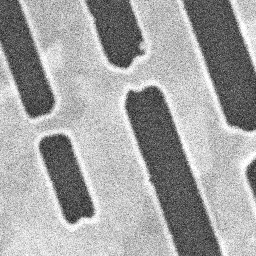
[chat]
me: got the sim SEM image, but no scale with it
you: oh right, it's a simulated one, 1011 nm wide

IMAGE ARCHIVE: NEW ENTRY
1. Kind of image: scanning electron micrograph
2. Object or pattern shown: one or a few lines or trenches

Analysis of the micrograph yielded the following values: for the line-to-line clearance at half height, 0.179 micrometres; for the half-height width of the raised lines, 227 nm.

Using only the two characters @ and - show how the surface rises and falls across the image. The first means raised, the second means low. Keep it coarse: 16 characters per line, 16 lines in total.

--@@@---@@@----@
--@@@@---@@@---@
--@@@@---@@@---@
---@@@---@@@----
@--@@@@@@@@@@---
@--@@@@@--@@@---
@---@@@@---@@@--
@@@@@@@@---@@@--
@@@-@@@@---@@@@@
@@---@@@@---@@@@
@@@--@@@@---@@@-
@@@---@@@---@@@-
@@@---@@@@---@@@
@@@@--@@@@---@@@
@@@@@@@@@@----@@
@@@@@@@@@@@---@@